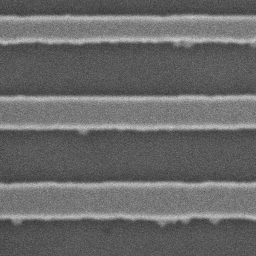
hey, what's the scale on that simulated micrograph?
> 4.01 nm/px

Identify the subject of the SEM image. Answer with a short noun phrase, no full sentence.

lines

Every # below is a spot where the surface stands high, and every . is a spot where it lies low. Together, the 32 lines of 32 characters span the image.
................................
................................
################################
################################
################################
#...............................
................................
................................
................................
................................
................................
................................
################################
################################
################################
################################
................................
................................
................................
................................
................................
................................
................................
################################
################################
################################
################################
................................
................................
................................
................................
................................